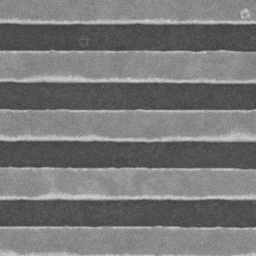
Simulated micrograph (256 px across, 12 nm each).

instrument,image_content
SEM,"lines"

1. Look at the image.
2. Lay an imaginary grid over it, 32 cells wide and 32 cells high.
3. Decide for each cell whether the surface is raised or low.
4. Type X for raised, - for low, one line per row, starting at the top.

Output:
XXXXXXXXXXXXXXXXXXXXXXXXXXXXXXXX
XXXXXXXXXXXXXXXXXXXXXXXXXXXXXXXX
XXXXXXXXXXXXXXXXXXXXXXXXXXXXXXXX
--------------------------------
--------------------------------
--------------------------------
XXXXXXXXXXXXXXXXXXXXXXXX-XXXXX--
XXXXXXXXXXXXXXXXXXXXXXXXXXXXXXXX
XXXXXXXXXXXXXXXXXXXXXXXXXXXXXXXX
XXXXXXXXXXXXXXXXXXXXXXXXXXXXXXXX
--------------------------------
--------------------------------
--------------------------------
--------------------------------
XXXXXXXXXXXXXXXXXXXXXXXXXXXXXXXX
XXXXXXXXXXXXXXXXXXXXXXXXXXXXXXXX
XXXXXXXXXXXXXXXXXXXXXXXXXXXXXXXX
XXXXXXXXXXXXXXXXXXXXXXXXXXXXXXXX
--------------------------------
--------------------------------
--------------------------------
XXXXXXXXXXXXXXXXXXXXXXXXXXXXXXXX
XXXXXXXXXXXXXXXXXXXXXXXXXXXXXXXX
XXXXXXXXXXXXXXXXXXXXXXXXXXXXXXXX
XXXXXXXXXXXXXXXXXXXXXXXXXXXXXXXX
--------------------------------
--------------------------------
--------------------------------
XXXXXXXXXXXXXXXXXXXXXXX-X--X----
XXXXXXXXXXXXXXXXXXXXXXXXXXXXXXXX
XXXXXXXXXXXXXXXXXXXXXXXXXXXXXXXX
XXXXXXXXXXXXXXXXXXXXXXXXXXXXXXXX